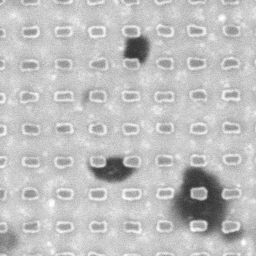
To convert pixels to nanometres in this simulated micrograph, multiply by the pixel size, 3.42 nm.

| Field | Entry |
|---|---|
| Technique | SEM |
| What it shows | a regular array of raised bodies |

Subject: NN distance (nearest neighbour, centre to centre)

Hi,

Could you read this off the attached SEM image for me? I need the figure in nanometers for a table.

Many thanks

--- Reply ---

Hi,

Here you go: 110